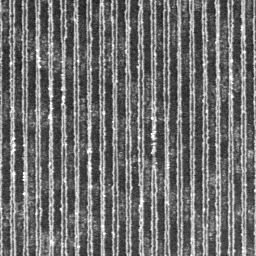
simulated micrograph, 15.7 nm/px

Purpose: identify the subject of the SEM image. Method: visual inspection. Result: parallel lines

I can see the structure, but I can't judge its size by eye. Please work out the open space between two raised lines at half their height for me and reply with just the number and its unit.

0.141 um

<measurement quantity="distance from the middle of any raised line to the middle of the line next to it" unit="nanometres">202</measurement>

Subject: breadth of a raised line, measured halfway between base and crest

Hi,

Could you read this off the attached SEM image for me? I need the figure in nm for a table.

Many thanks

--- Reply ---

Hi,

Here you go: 54.9